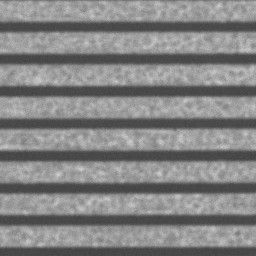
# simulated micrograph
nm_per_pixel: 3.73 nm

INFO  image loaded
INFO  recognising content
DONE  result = parallel lines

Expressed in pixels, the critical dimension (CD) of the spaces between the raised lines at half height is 12.4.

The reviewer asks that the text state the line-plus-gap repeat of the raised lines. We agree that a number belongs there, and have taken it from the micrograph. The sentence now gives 120 nm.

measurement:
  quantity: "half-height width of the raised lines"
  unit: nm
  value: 76